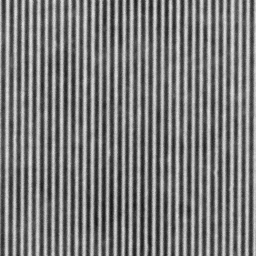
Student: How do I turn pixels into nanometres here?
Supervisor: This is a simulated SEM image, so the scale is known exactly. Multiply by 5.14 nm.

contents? parallel lines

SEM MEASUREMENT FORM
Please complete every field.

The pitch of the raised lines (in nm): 39.9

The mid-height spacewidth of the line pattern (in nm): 25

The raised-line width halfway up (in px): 2.74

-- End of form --